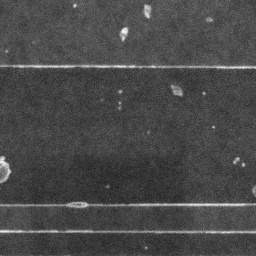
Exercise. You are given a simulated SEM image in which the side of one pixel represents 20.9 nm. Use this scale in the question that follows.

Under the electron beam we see lines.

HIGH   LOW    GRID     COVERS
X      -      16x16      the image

XXXXXXXXXXXXXXXX
XXXXXXXXXXXXXXXX
XXXXXXXXXXXXXXXX
XXXXXXXXXXXXXXXX
----------------
----------------
----------------
----------------
----------------
----------------
----------------
----------------
----------------
XXXXXXXXXXXXXXXX
XXXXXXXXXXXXXXXX
XXXXXXXXXXXXXXXX